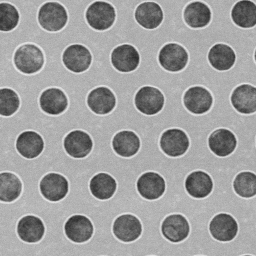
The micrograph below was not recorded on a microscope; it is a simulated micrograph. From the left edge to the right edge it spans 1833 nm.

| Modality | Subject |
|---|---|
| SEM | a regular array of holes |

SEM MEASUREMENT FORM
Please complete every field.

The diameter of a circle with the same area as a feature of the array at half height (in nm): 204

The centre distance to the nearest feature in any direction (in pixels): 48.1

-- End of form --